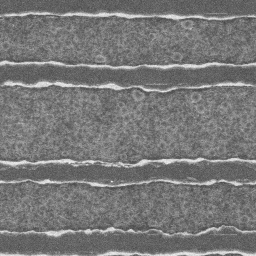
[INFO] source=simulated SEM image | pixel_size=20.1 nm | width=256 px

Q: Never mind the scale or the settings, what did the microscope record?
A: one or a few lines or trenches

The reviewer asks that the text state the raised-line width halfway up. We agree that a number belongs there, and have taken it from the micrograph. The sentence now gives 0.447 um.